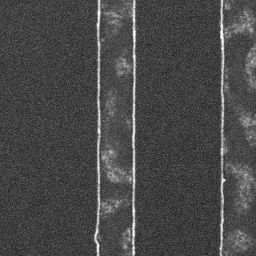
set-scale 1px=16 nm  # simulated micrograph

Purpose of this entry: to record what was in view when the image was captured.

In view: one or a few lines or trenches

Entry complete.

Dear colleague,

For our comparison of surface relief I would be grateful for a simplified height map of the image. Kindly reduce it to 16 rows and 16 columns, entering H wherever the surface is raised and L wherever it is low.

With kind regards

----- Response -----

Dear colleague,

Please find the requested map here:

HHHHHHLLHHHHHHLL
HHHHHHLLHHHHHHLL
HHHHHHLLHHHHHHLL
HHHHHHLLHHHHHHLL
HHHHHHLLHHHHHHLL
HHHHHHLLHHHHHHLL
HHHHHHLLHHHHHHLL
HHHHHHLLHHHHHHLL
HHHHHHLLHHHHHHLL
HHHHHHLLHHHHHHLL
HHHHHHLLHHHHHHLL
HHHHHHLLHHHHHHLL
HHHHHHLLHHHHHHLL
HHHHHHLLHHHHHHLL
HHHHHHLLHHHHHHLL
HHHHHHLLHHHHHHLL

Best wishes